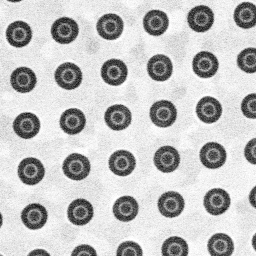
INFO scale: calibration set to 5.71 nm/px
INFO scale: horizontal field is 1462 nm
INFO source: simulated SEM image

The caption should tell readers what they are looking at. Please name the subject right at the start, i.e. an array of small figures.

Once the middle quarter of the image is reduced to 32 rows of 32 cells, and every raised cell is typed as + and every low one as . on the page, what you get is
....+++++.......++++..+++...++++
....+++++..+++..+++++.+++..+++++
++...++++..+++..+++++..++..+++++
+++..++++.......++++++.....+++++
.....+++++.....++++++++..+++++++
....+++++++...++++++++++++++++++
..++++++++++++++++++++++++++++++
++++++++++++++++++++++++++++++++
++++++++++++++++++++++++++++++++
+++++++++++++++++++++++....+++++
+++++++++++.....++++++......++++
....++++++.......++++...++..++++
.....+++++..++...++++..+++..++++
.++...++++..+++..++++...++..++++
.+++..++++...+...+++++......++++
.++..++++++.....+++++++....+++++
.....+++++++...+++++++++++++++++
+...++++++++++++++++++++++++++++
++++++++++++++++++++++++++++++++
++++++++++++++++++++++++++++++++
+++++++++++++++++++++++++..+++++
+++++++++++++...+++++++.....++++
+....+++++++.....+++++...++..+++
......+++++...+...++++..+++..+++
..++...++++..+++..++++..+++..+++
.+++...++++..+++..+++++......+++
..++...++++.......+++++.....++++
......++++++.....+++++++++++++++
+....+++++++++++++++++++++++++++
++++++++++++++++++++++++++++++++
++++++++++++++++++++++++++++++++
++++++++++++++++++++++++++++++++